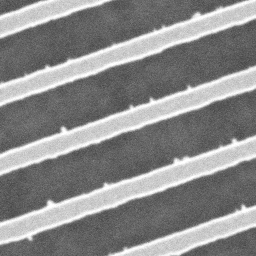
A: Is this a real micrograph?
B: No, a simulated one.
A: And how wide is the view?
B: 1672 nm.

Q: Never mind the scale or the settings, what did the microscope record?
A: lines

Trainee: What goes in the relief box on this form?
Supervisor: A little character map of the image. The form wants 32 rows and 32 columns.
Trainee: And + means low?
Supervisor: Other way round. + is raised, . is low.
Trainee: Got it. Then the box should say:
....+++++++++.................++
..+++++++..................+++++
++++++..................+++++++.
+++..................+++++++....
+.................+++++++.......
...............+++++++..........
............++++++++............
.........++++++++...............
......+++++++...................
...++++++++.................++++
++++++++..................++++++
+++++..................+++++++..
++..................+++++++.....
.................++++++++.......
..............++++++++..........
...........++++++++.............
........+++++++.................
.....++++++++..................+
..++++++++..................++++
+++++++..................+++++++
++++..................++++++++..
+..................++++++++.....
................++++++++........
.............++++++++...........
..........++++++++..............
.......++++++++.................
....++++++++..................++
.++++++++..................+++++
++++++..................+++++++.
++++.................+++++++....
..................++++++++......
...............++++++++.........